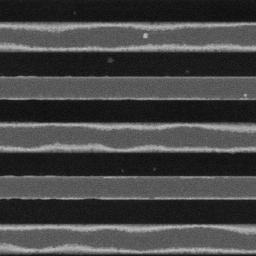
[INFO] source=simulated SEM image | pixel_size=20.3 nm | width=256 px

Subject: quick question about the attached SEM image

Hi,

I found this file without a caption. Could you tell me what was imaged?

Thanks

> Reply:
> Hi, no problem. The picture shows lines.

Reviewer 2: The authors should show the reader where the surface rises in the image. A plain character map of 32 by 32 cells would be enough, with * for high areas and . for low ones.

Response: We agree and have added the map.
................................
................................
................................
********************************
********************************
********************************
................................
................................
................................
................................
********************************
********************************
................................
................................
................................
************..........**........
********************************
********************************
********************************
................................
................................
................................
********************************
********************************
********************************
................................
................................
................................
********************************
********************************
********************************
.******....*********************